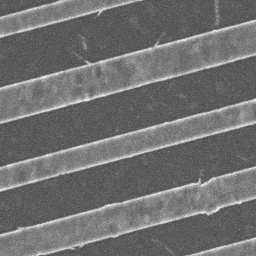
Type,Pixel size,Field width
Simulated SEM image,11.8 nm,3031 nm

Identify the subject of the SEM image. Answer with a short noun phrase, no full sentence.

one or a few lines or trenches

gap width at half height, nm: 509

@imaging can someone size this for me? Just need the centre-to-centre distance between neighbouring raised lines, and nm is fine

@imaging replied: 836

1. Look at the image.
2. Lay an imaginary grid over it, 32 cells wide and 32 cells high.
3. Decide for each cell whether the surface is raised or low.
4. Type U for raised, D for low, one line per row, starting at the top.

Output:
DDDDDDUUUUUUUUUUDDDDDDDDDDDDDDDD
DDDUUUUUUUUUDDDDDDDDDDDDDDDDDDDD
UUUUUUUUDDDDDDDDDDDDDDDDDDDDDDDD
UUUUDDDDDDDDDDDDDDDDDDDDDDDDUUUU
UDDDDDDDDDDDDDDDDDDDDDDDUUUUUUUU
DDDDDDDDDDDDDDDDDDDDDUUUUUUUUUUU
DDDDDDDDDDDDDDDDDUUUUUUUUUUUUUUU
DDDDDDDDDDDDDUUUUUUUUUUUUUUUUDDD
DDDDDDDDDUUUUUUUUUUUUUUUUUDDDDDD
DDDDDDUUUUUUUUUUUUUUUUDDDDDDDDDD
DDUUUUUUUUUUUUUUUUDDDDDDDDDDDDDD
UUUUUUUUUUUUUUUDDDDDDDDDDDDDDDDD
UUUUUUUUUUUDDDDDDDDDDDDDDDDDDDDD
UUUUUUUDDDDDDDDDDDDDDDDDDDDDUUUU
UUUUDDDDDDDDDDDDDDDDDDDDUUUUUUUU
DDDDDDDDDDDDDDDDDDDDUUUUUUUUUUUD
DDDDDDDDDDDDDDDDDUUUUUUUUUUUDDDD
DDDDDDDDDDDDDUUUUUUUUUUUDDDDDDDD
DDDDDDDDDUUUUUUUUUUUDDDDDDDDDDDD
DDDDDUUUUUUUUUUUDDDDDDDDDDDDDDDD
DDUUUUUUUUUUUDDDDDDDDDDDDDDDDDDD
UUUUUUUUUDDDDDDDDDDDDDDDDDDDDDUU
UUUUUDDDDDDDDDDDDDDDDDDDDDUUUUUU
UDDDDDDDDDDDDDDDDDDDDDUUUUUUUUUU
DDDDDDDDDDDDDDDDDDUUUUUUUUUUUUUU
DDDDDDDDDDDDDDUUUUUUUUUUUUUUUDDD
DDDDDDDDDDDUUUUUUUUUUUUUUUUDDDDD
DDDDDDDUUUUUUUUUUUUUUUDDDDDDDDDD
DDDUUUUUUUUUUUUUUUDDDDDDDDDDDDDD
UUUUUUUUUUUUUUDDDDDDDDDDDDDDDDDD
UUUUUUUUUUUDDDDDDDDDDDDDDDDDDUUU
UUUUUUDDDDDDDDDDDDDDDDDDDUUUUUUU